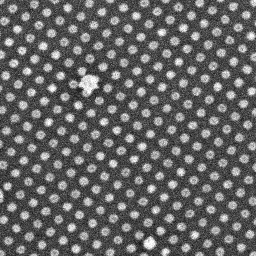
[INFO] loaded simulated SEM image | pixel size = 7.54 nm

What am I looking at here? a regular array of raised bodies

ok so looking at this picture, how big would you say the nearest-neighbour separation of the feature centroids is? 113 nanometers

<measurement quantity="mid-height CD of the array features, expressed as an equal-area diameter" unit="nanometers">57.7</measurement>